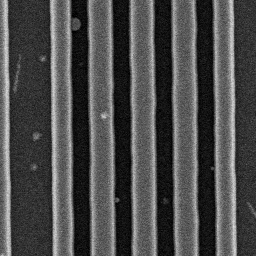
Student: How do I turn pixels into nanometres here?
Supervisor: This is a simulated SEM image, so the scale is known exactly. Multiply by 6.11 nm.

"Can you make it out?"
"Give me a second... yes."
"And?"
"groups of lines, slits or small figures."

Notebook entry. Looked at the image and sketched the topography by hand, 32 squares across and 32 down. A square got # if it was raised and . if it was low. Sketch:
#.....###..###..###...##...##...
#.....###..###..###...##...##...
#......##..###..###...##...##...
#......##..###..###...##...##...
#......##..###..###...##...##...
#......##..###..###...##...##...
#......##..###..###...##...##...
#......##..###..###...##...##...
#......##..###..###...##...##...
#......##..###..###...##...##...
#......##..###..###...##...##...
#......##..###..###...###..##...
#......##..###..###...###..##...
#......##..###..###...###..##...
#......##..###...##...###..##...
#......##..###...##...###..##...
#......##..###...##...###..##...
#......##..###...##...###..##...
#......##..###...##...###..##...
#......##..###...##...###..##...
#......##..###...##...###..##...
#......##..###...##...###..##...
#......##..###...##...###..##...
#......##..###...##...###..##...
#......##..###...##...###..##...
#......##..###...##...###..##...
#......##..###...##...###..##...
#......##..###...##...###..##...
#......##..###...###..###..##...
#......##..###...###..###..##...
#......##..###...###..###..##...
#......##..###...###..###..##...